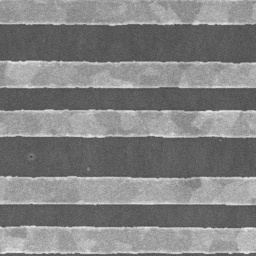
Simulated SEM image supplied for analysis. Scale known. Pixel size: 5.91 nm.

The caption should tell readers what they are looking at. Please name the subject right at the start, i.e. lines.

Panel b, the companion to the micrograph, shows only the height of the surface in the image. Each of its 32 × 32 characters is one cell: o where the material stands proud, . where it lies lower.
oooooooooooooooooooooooooooooooo
oooooooooooooooooooooooooooooooo
oooooooooooooooooooooooooooooooo
................................
................................
................................
................................
................................
oooooooooooooooooooooooooooooooo
oooooooooooooooooooooooooooooooo
oooooooooooooooooooooooooooooooo
................................
................................
................................
oooooooooooooooooooooooooooooooo
oooooooooooooooooooooooooooooooo
oooooooooooooooooooooooooooooooo
................................
................................
................................
................................
................................
oooooooooooooooooooooooooooooooo
oooooooooooooooooooooooooooooooo
oooooooooooooooooooooooooooooooo
................................
................................
................................
.ooooooo.ooo......oo............
oooooooooooooooooooooooooooooooo
oooooooooooooooooooooooooooooooo
o.oooooooooooooooooooooooooooooo